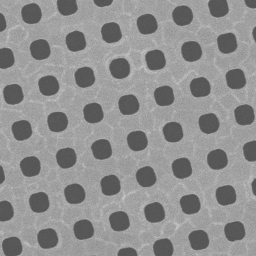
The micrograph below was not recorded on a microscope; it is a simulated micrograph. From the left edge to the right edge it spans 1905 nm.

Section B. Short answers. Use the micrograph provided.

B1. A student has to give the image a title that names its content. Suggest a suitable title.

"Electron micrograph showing a regular array of holes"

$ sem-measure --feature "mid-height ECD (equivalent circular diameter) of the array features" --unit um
0.156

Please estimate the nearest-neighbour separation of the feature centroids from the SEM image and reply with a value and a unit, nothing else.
0.272 microns